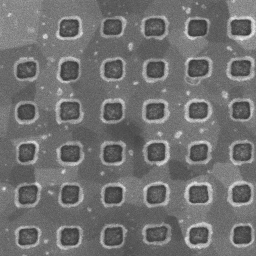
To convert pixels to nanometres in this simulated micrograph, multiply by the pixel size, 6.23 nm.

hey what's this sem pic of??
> a regular array of holes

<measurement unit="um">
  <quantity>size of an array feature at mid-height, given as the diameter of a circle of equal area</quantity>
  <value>0.132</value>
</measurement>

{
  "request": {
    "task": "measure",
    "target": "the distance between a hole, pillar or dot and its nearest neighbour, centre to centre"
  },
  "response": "258 nm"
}